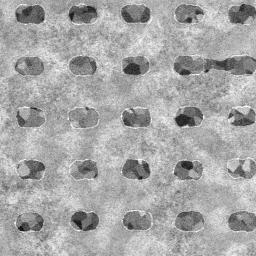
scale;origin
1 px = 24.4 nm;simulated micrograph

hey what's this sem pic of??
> a regular array of raised bodies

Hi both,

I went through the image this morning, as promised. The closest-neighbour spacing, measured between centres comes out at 1.25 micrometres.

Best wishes